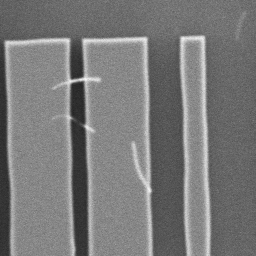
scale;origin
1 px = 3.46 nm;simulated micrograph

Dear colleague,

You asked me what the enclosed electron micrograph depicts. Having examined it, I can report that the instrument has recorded groups of lines, slits or small figures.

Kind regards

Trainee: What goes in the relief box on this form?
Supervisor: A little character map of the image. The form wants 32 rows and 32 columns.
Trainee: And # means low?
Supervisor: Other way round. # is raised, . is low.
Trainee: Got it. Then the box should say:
................................
................................
................................
................................
................................
.########.########.....###......
.########.########.....###......
.########.########.....###......
.########.########.....###......
.########.########.....###......
.########.#########....###......
.########..########....###......
.########..########....###......
.########..########....###......
.########..########....###......
.########..########....###......
.########..########....###......
.########..########....###......
.########..########....###......
.########..########....###......
.########..########....###......
.########..########....###......
.########..########....###......
.########..########....###......
.########..########....###......
.########..########....###......
.########..########....###......
.########..########....###......
.########..########....###......
.########..########....###......
.########..########....###......
.########..########....###......